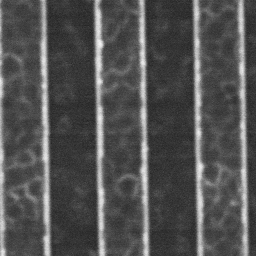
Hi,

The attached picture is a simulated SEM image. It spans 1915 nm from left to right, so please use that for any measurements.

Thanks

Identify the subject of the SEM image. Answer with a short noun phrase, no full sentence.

one or a few lines or trenches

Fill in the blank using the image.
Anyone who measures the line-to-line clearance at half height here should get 392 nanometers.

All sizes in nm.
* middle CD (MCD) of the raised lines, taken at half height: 349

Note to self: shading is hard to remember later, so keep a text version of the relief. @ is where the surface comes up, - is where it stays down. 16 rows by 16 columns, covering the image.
@@@---@@@---@@@-
@@@---@@@---@@@-
@@@---@@@---@@@-
@@@---@@@---@@@-
@@@---@@@---@@@-
@@@---@@@---@@@-
@@@---@@@---@@@-
@@@---@@@---@@@-
@@@---@@@---@@@-
@@@---@@@---@@@-
@@@---@@@---@@@-
@@@---@@@---@@@-
@@@---@@@---@@@-
@@@---@@@---@@@-
@@@---@@@---@@@-
@@@---@@@----@@-